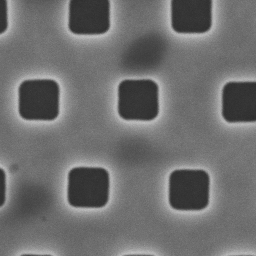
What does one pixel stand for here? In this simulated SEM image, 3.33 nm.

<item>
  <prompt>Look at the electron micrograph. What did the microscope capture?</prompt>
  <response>holes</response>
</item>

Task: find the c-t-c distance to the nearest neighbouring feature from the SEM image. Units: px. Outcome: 99.8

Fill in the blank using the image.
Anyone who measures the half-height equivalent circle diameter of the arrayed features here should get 0.149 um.